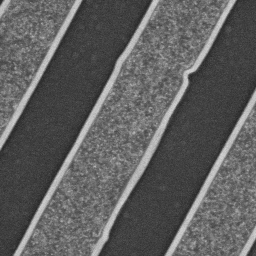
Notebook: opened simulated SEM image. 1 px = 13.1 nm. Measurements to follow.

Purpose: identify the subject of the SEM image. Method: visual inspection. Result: one or a few lines or trenches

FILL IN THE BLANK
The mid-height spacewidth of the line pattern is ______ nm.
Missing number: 872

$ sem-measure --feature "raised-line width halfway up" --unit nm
872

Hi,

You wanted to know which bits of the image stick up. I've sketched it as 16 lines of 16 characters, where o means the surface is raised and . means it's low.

ooooo.....oooo..
oooo.....ooooo..
oooo....ooooo...
ooo.....ooooo...
ooo....ooooo....
oo.....oooo.....
o.....ooooo.....
o.....oooo.....o
.....ooooo.....o
.....oooo.....oo
....ooooo....ooo
...ooooo.....ooo
...ooooo....oooo
..ooooo.....oooo
..ooooo....ooooo
.ooooo.....oooo.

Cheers